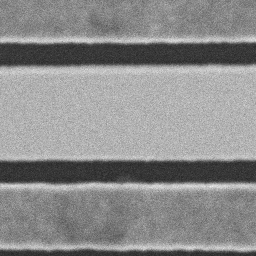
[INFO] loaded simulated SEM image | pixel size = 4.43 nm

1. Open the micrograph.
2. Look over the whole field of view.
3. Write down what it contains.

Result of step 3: lines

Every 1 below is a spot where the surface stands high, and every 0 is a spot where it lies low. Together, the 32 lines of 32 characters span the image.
11111111111111111111111111111111
11111111111111111111111111111111
11111111111111111111111111111111
11111111111111111111111111111111
11111111111111111111111111111111
00000000000000000000000000000000
00000000000000000000000000000000
00000000000000000000000000000000
11111111111111111111111111111111
11111111111111111111111111111111
11111111111111111111111111111111
11111111111111111111111111111111
11111111111111111111111111111111
11111111111111111111111111111111
11111111111111111111111111111111
11111111111111111111111111111111
11111111111111111111111111111111
11111111111111111111111111111111
11111111111111111111111111111111
11111111111111111111111111111111
00000000000000000000000000000000
00000000000000000000000000000000
00000000000000000000000000000000
11111111111111111111111111111111
11111111111111111111111111111111
11111111111111111111111111111111
11111111111111111111111111111111
11111111111111111111111111111111
11111111111111111111111111111111
11111111111111111111111111111111
11111111111111111111111111111111
00000000000000000000000000000000